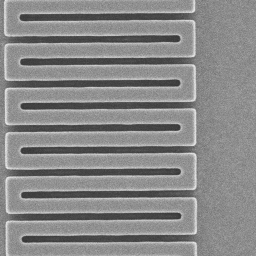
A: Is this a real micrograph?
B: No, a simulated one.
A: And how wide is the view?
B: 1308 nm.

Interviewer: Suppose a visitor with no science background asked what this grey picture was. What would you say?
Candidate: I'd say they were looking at groups of lines, slits or small figures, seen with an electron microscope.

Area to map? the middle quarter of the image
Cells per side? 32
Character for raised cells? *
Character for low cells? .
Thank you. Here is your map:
.*******************************
********************************
********************************
********************************
.............................***
.............................***
********************************
********************************
********************************
*..**...........................
................................
........***.....****************
********************************
********************************
********************************
.............................***
.............................***
********************************
********************************
********************************
*****************.*.............
................................
.........................***.***
********************************
********************************
********************************
.............................***
.............................***
********************************
********************************
********************************
*************************.......